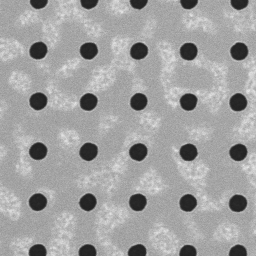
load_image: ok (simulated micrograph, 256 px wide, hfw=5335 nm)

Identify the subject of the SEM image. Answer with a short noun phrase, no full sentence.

a regular array of holes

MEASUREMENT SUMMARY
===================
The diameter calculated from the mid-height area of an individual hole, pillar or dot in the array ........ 377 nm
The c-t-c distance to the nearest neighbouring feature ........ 1040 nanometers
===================